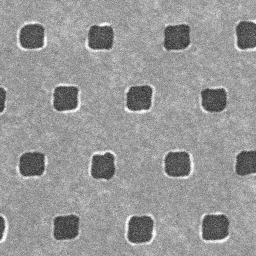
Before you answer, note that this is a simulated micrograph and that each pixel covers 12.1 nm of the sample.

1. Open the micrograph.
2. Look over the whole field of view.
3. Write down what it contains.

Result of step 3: a regular array of holes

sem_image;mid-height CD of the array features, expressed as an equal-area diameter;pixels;28.6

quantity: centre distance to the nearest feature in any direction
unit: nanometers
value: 869